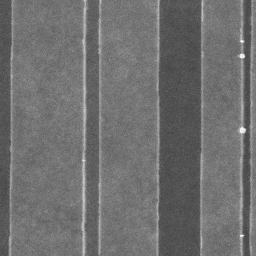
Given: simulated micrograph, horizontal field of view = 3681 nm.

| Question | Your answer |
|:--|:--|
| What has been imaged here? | lines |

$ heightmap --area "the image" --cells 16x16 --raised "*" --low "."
.*********...***
.*********...***
.*********...***
.*********...***
.*********...***
.*********...***
.*********...***
.*********...***
.*********...***
.*********...***
.*********...***
.*********...***
.*********...***
.*********...***
.*********...***
.*********...***